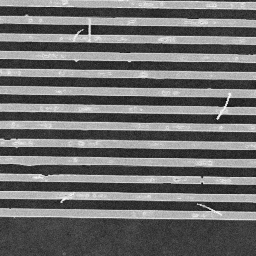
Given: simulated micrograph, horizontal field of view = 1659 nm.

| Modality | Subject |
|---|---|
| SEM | parallel lines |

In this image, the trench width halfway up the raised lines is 61.5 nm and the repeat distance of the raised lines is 113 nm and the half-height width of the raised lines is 7.62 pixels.